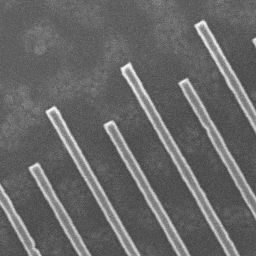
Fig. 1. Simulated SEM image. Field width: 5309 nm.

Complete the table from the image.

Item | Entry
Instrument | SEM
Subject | parallel lines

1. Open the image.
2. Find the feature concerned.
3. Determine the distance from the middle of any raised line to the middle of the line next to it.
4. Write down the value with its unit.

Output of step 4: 892 nanometres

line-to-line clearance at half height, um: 0.709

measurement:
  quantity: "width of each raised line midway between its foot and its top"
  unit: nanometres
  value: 173